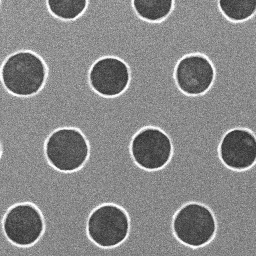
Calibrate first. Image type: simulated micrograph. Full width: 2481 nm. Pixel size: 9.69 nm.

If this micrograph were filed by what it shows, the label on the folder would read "a regular array of holes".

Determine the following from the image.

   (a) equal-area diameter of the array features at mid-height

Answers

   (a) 386 nm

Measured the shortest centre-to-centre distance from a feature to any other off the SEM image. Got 0.821 µm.